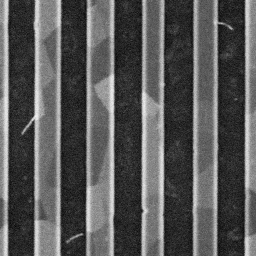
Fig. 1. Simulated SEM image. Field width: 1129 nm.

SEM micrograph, parallel lines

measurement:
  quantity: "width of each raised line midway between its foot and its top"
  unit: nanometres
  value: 96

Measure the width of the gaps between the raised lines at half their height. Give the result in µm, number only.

0.135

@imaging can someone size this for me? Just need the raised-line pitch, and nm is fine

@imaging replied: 232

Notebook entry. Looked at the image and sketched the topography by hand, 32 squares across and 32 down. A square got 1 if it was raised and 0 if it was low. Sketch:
10000110000111000011000011100001
10000110000111000011000011100001
10000110000111000011000011100001
10000110000111000011000011100001
10000110000111000011000011100001
10000110000111000011000011100001
10000110000111000011000011100001
10000110000111000011000011100001
10000110000111000011000011100001
10000110000111000011000011100001
10000110000111000011000011100001
10000110000111000011000011100001
10000110000111000011000011100001
10000110000111000011000011100001
10000110000111000011000011100001
10000110000111000011000011100001
10000110000111000011000011100001
10000110000111000011000011100001
10000110000111000011000011100001
10000110000111000011000011100001
10000110000111000011000011100001
10000110000111000011000011100001
10000110000111000011000011100001
10000110000111000011000011100001
10000110000111000011000011100001
10000110000111000011000011100001
10000110000111000011000011100001
10000110000111000011000011100001
10000110000111000011000011100001
10000110000111000011000011100001
10000110000111000011000011100001
10000110000111000011000011100001